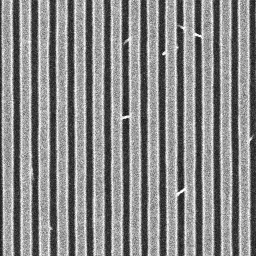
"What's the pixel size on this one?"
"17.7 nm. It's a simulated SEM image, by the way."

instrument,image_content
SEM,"parallel lines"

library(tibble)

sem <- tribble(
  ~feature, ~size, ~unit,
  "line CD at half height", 183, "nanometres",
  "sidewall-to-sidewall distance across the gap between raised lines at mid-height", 0.135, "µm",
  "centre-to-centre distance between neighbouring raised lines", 18.2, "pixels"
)